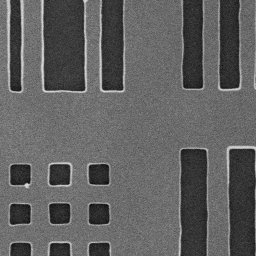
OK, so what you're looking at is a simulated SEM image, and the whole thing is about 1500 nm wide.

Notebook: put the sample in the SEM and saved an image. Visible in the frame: groups of lines, slits or small figures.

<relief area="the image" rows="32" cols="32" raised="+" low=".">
+..++......++..++++++++..++...++
+..++......++..++++++++..++...++
+..++......++..++++++++..++...++
+..++......++..++++++++..++...++
+..++......++..++++++++..++...++
+..++......+....+++++++..++...++
+..++......+...++++++++..++...++
+..++......++..++++++++..++...++
+..++......++...+++++++..++...++
+..++......++..++++++++..++...++
+..++......++..++++++++..++...++
++++++++++++++++++++++++++++++++
++++++++++++++++++++++++++++++++
++++++++++++++++++++++++++++++++
++++++++++++++++++++++++++++++++
++++++++++++++++++++++++++++++++
++++++++++++++++++++++++++++++++
++++++++++++++++++++++++++++++++
+++++++++++++++++++++++++++++..+
++++++++++++++++++++++....++....
++.++++.++++.++++++++++...++....
+...++...++...+++++++++...+++...
+...++...++...+++++++++...+++...
+++++++++++++++++++++++...++....
+++++++++++++++++++++++...+++...
++.+++..+++..+++++++++....+++...
+...++...++...++++++++....+++...
+...++...++...+++++++++...+++...
+++++++++++++++++++++++...+++...
+++++++++++++++++++++++...+++...
++..++..+++..+++++++++....+++...
+...++...++...++++++++....+++...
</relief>